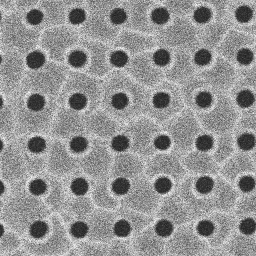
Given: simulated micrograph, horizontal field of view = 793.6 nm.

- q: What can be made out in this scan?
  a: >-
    a regular array of holes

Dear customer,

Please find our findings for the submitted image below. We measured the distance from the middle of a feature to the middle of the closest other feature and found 129 nm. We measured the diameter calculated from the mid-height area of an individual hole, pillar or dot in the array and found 0.0536 micrometres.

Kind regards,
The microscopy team